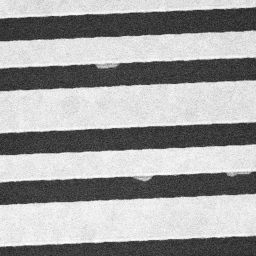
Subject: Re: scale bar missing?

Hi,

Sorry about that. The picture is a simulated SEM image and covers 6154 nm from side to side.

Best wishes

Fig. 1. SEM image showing lines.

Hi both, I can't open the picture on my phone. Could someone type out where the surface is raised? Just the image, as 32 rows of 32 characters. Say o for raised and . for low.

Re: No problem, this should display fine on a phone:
oooooooooooooooooooooooooooooooo
oooooooooooooooo................
................................
................................
.................ooooooooooooooo
oooooooooooooooooooooooooooooooo
oooooooooooooooooooooooooooooooo
oooooooooooooooooooooo..........
................................
................................
......................oooooooooo
oooooooooooooooooooooooooooooooo
oooooooooooooooooooooooooooooooo
oooooooooooooooooooooooooooooooo
oooooooooooooooooooooooooooooooo
oooooooooooooooooooooooo........
o...............................
................................
.......................ooooooooo
oooooooooooooooooooooooooooooooo
oooooooooooooooooooooooooooooooo
oooooooooooooooooooooooooooo....
ooo.............................
................................
............................oooo
....oooooooooooooooooooooooooooo
oooooooooooooooooooooooooooooooo
oooooooooooooooooooooooooooooooo
oooooooooooooooooooooooooooooooo
oooooooooooooooooooooooooooo....
oooooo..........................
................................